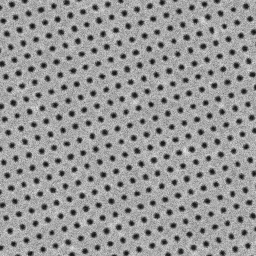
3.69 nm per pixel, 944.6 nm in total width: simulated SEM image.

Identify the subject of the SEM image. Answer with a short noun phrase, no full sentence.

a regular array of holes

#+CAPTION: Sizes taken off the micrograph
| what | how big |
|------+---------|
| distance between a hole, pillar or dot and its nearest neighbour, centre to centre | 48 nanometers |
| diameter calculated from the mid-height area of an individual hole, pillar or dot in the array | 22.8 nanometres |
